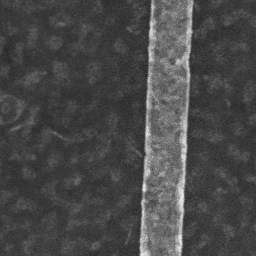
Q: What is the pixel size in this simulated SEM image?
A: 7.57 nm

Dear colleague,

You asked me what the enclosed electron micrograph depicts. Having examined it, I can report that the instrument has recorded one or a few lines or trenches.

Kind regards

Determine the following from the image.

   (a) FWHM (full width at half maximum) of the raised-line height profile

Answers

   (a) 0.302 um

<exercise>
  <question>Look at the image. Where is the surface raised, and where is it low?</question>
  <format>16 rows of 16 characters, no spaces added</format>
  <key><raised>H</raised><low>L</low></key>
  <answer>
LLLLLLLLLHHHLLLL
LLLLLLLLLHHHLLLL
LLLLLLLLLHHHLLLL
LLLLLLLLLHHHLLLL
LLLLLLLLLHHHLLLL
LLLLLLLLLHHHLLLL
LLLLLLLLLHHHLLLL
LLLLLLLLLHHHLLLL
LLLLLLLLLHHHLLLL
LLLLLLLLLHHHLLLL
LLLLLLLLLHHHLLLL
LLLLLLLLLHHLLLLL
LLLLLLLLLHHLLLLL
LLLLLLLLLHHLLLLL
LLLLLLLLLHHLLLLL
LLLLLLLLLHHLLLLL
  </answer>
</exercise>